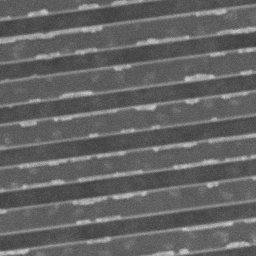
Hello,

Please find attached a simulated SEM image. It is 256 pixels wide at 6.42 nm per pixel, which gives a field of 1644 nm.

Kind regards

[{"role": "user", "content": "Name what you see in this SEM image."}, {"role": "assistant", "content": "parallel lines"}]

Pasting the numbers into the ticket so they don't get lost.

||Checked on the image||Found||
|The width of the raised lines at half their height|0.158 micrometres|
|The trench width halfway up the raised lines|114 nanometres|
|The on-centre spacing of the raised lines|273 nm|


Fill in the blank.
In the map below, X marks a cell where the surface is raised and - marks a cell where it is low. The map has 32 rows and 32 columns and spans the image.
XXXXXXXXXXXXXXXX----------------
XXXXXXXX-----------------XXXXXXX
X----------------XXXXXXXXXXXXXXX
----------XXXXXXXXXXXXXXXXXXXXXX
--XXXXXXXXXXXXXXXXXXXXXXXX------
XXXXXXXXXXXXXXXXXXX-------------
XXXXXXXXXXX-----------------XXXX
XXXX-----------------XXXXXXXXXXX
-------------XXXXXXXXXXXXXXXXXXX
------XXXXXXXXXXXXXXXXXXXXXXX---
XXXXXXXXXXXXXXXXXXXXX-----------
XXXXXXXXXXXXXX-----------------X
XXXXXX-----------------XXXXXXXXX
----------------XXXXXXXXXXXXXXXX
--------XXXXXXXXXXXXXXXXXXXXXXX-
-XXXXXXXXXXXXXXXXXXXXXXX--------
XXXXXXXXXXXXXXXX----------------
XXXXXXXXX-----------------XXXXXX
X------------------XXXXXXXXXXXXX
-----------XXXXXXXXXXXXXXXXXXXXX
---XXXXXXXXXXXXXXXXXXXXXXX------
XXXXXXXXXXXXXXXXXXX-------------
XXXXXXXXXXXX-----------------XXX
XXXX-----------------XXXXXXXXXXX
--------------XXXXXXXXXXXXXXXXXX
------XXXXXXXXXXXXXXXXXXXXXXX---
XXXXXXXXXXXXXXXXXXXXXX----------
XXXXXXXXXXXXXX----------------XX
XXXXXX-----------------XXXXXXXXX
---------------XXXXXXXXXXXXXXXXX
--------XXXXXXXXXXXXXXXXXXXXXXXX
XXXXXXXXXXXXXXXXXXXXXXXXX-------